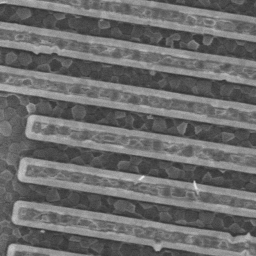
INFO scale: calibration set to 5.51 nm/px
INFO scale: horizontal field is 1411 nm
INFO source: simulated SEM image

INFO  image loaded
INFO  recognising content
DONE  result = parallel lines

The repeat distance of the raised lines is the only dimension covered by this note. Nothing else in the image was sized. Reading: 0.24 um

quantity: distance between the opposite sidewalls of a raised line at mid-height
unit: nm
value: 101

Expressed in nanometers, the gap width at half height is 139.